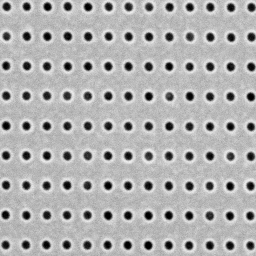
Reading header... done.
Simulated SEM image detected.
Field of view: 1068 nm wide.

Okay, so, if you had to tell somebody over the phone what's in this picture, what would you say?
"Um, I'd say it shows a regular array of holes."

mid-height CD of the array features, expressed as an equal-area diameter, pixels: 9.09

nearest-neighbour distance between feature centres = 84.4 nanometres